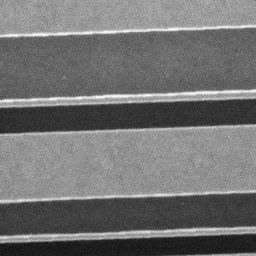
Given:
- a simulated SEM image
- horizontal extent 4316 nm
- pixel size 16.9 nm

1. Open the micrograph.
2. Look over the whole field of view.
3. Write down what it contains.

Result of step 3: lines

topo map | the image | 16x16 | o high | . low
oooooooooooooooo
oooooooooooooooo
................
................
................
................
................
................
oooooooooooooooo
oooooooooooooooo
oooooooooooooooo
oooooooooooooooo
ooo.............
................
................
................